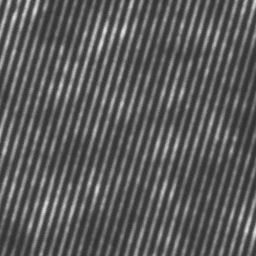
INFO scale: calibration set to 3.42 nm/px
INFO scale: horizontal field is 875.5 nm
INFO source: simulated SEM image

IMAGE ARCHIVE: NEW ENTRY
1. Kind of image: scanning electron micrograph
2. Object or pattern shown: parallel lines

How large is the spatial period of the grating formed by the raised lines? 0.0311 micrometres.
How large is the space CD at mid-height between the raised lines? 21.8 nm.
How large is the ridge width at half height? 9.5 nm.